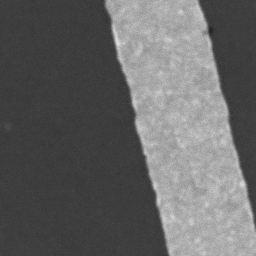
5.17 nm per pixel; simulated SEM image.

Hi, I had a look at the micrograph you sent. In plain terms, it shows one or a few lines or trenches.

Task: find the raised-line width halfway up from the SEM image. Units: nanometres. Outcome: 458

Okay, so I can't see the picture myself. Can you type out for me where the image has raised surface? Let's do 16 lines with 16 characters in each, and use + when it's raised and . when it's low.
.......+++++....
.......++++++...
.......++++++...
.......++++++...
........++++++..
........++++++..
........++++++..
.........+++++..
.........+++++..
.........++++++.
.........++++++.
..........+++++.
..........++++++
..........++++++
..........++++++
..........++++++